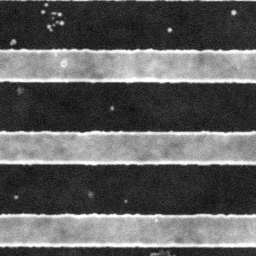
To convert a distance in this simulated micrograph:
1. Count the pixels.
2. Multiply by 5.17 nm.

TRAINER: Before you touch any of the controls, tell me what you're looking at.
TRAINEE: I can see lines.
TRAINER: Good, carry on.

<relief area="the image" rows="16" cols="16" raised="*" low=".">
................
................
................
****************
****************
................
................
................
****************
****************
................
................
................
****************
****************
................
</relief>